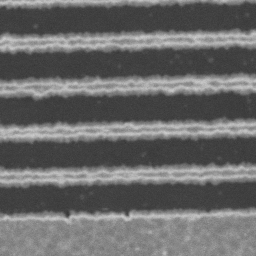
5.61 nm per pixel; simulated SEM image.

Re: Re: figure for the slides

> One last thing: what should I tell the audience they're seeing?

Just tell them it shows parallel lines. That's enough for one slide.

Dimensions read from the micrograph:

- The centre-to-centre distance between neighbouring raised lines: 250 nm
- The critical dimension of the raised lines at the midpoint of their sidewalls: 67.3 nanometres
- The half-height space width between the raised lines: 0.181 micrometres